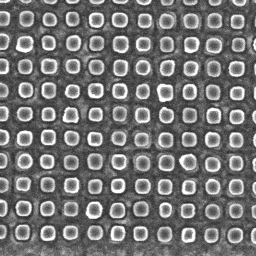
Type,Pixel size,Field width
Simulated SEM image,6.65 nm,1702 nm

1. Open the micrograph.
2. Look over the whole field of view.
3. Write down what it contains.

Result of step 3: a regular array of raised bodies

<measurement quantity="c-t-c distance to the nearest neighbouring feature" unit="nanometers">152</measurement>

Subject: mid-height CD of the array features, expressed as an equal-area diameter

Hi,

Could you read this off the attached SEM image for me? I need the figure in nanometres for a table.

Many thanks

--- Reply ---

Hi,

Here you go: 99.1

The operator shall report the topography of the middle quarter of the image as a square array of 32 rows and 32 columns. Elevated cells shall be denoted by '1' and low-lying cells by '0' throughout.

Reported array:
01110001110001110011100011100011
01110001110001110011100011100011
00000001100001110000100011100011
00000000000000000000000000000000
00000000000000000000000000000000
01100011110011100001100011100011
11110011110011110011100111100011
11110011110011110011100011100011
00100000000000000001100011100011
00000000000000000000000000000000
00000000000000000000000000000000
11100001100011110011100011100011
11100011100011110011100011100011
11110011100011100011100011100011
11100000000000000011100001100000
00000000000000000000000000000000
00000000000000000000000000000000
11100011100011100001100011000011
11110011100011100011100011100011
11100011100011100011100011100011
00000000000000000000000011100000
00000000000000000000000000000000
00000000000000000000000000000000
11100011100011100001100011100111
11100011100011100011100011100111
11100011100011100011100011100111
00000000000000000001100001100010
00000000000000000000000000000000
00000000000000000000000000000000
11110011100011100011100011100011
11110011100011100011100011100011
11110011100011100011100011100011